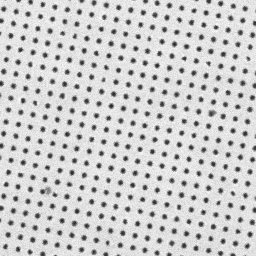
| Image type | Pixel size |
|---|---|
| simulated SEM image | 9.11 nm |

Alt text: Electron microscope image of a regular array of holes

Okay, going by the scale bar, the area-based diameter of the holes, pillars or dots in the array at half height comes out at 51.4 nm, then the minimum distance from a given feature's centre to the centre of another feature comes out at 0.11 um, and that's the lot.